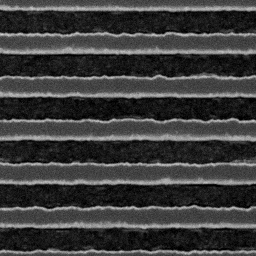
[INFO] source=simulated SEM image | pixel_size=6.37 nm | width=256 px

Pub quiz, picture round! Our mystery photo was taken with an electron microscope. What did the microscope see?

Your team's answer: lines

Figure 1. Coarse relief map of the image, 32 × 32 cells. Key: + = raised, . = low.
++++++++++++++++++++++++++++++++
................................
................................
................................
++++++++++++++++++++++++++++++++
++++++++++++++++++++++++++++++++
++++++++++++++++++++++++++++++++
................................
................................
...............+...+.....++....+
++++++++++++++++++++++++++++++++
++++++++++++++++++++++++++++++++
................................
................................
................................
++++++++++++++++++++++++++++++++
++++++++++++++++++++++++++++++++
+.+.+..+.++++......++.++++..++++
................................
................................
+..+++++.++++.++.+.+.++...+++++.
++++++++++++++++++++++++++++++++
++++++++++++++++++++++++++++++++
................................
................................
................................
++++++++++++++++++++++++++++++++
++++++++++++++++++++++++++++++++
.................++.............
................................
................................
++++++++++++++++++++++++++++++++